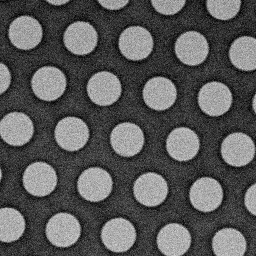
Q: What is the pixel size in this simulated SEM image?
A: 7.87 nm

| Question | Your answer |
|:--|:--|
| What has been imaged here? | an array of small figures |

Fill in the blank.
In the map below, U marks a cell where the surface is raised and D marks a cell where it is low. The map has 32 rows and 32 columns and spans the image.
DDDDDDDUDDDDDUUUDDDUUUUDDDUUUUDD
DDDDDDDDDDDDDDDDDDDDUUDDDDUUUUDD
DDUUDDDDDDDDDDDDDDDDDDDDDDDDDDDD
DUUUUDDDUUUUDDDDUUDDDDDDDDDDDDDD
DUUUUDDDUUUUDDDUUUUDDDDUUDDDDDDD
DDUUUDDDUUUUDDDUUUUDDDUUUUDDDUUU
DDDDDDDDDUUDDDDUUUUDDDUUUUDDDUUU
DDDDDDDDDDDDDDDDDDDDDDDUUDDDDUUU
UDDDDUUDDDDDDDDDDDDDDDDDDDDDDDUU
UDDDUUUUDDDDUUDDDDDDDDDDDDDDDDDD
UDDDUUUUDDDUUUUDDDUUUUDDDDUUDDDD
DDDDUUUUDDDUUUUDDDUUUUDDDUUUUDDD
DDDDDDUDDDDDUUUDDDUUUUDDDUUUUDDD
DDDDDDDDDDDDDDDDDDDUUDDDDUUUUDDD
DUUDDDDDDDDDDDDDDDDDDDDDDDDDDDDD
UUUUDDDUUUUDDDDUUDDDDDDDDDDDDDDD
UUUUDDDUUUUDDDUUUUDDDDUUDDDDDDDD
DUUUDDDUUUUDDDUUUUDDDUUUUDDDUUUD
DDDDDDDDUUDDDDUUUUDDDUUUUDDDUUUU
DDDDDDDDDDDDDDDDDDDDDUUUDDDDUUUU
DDDDUUDDDDDDDDDDDDDDDDDDDDDDDUUD
DDDUUUUDDDDUUDDDDDDDDDDDDDDDDDDD
DDDUUUUDDDUUUUDDDUUUDDDDDUUDDDDD
DDDUUUUDDDUUUUDDDUUUUDDDUUUUDDDU
DDDDDDDDDDUUUDDDDUUUUDDDUUUUDDDU
DDDDDDDDDDDDDDDDDDUUDDDDUUUDDDDU
UUDDDDDDDDDDDDDDDDDDDDDDDDDDDDDU
UUUDDDUUUUDDDDUUDDDDDDDDDDDDDDDD
UUUDDDUUUUDDDUUUUDDDUUUDDDDDDDDD
UUUDDDUUUUDDDUUUUDDDUUUUDDDUUUDD
DDDDDDDUUDDDDUUUUDDDUUUUDDDUUUUD
DDDDDDDDDDDDDDDDDDDDUUUDDDDUUUUD